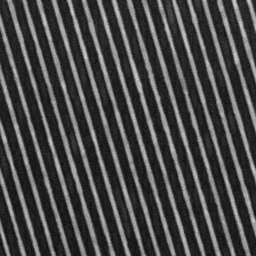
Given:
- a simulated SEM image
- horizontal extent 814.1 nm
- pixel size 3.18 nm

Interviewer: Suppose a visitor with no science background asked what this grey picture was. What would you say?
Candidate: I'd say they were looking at parallel lines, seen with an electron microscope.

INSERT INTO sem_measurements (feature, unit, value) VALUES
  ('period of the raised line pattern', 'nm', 45.7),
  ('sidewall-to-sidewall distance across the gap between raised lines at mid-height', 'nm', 38.1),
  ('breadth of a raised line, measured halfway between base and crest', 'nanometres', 8.8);